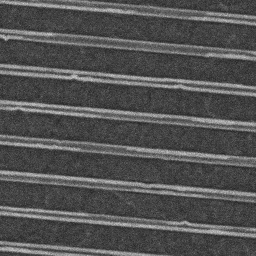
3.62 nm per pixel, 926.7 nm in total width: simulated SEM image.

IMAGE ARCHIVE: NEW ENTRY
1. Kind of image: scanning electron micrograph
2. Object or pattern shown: parallel lines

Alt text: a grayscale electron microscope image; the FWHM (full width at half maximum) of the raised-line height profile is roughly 30.7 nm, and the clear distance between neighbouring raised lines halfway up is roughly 94.8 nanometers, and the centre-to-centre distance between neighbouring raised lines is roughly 128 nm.